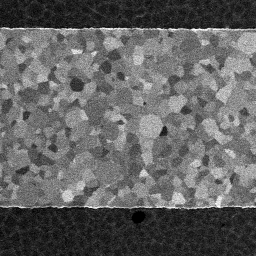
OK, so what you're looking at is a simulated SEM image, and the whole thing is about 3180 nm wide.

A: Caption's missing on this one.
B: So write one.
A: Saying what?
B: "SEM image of one or a few lines or trenches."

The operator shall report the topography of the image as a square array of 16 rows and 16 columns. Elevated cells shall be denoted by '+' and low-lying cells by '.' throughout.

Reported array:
..+.............
................
++++++++++++++++
++++++++++++++++
++++++++++++++++
++++++++++++++++
++++++++++++++++
++++++++++++++++
++++++++++++++++
++++++++++++++++
++++++++++++++++
++++++++++++++++
++++++++++++++++
................
................
................